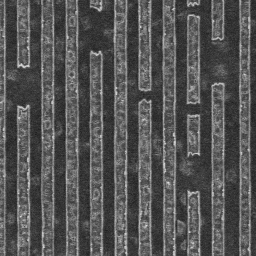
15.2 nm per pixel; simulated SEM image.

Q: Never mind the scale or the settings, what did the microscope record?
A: parallel lines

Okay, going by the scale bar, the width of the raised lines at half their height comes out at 0.185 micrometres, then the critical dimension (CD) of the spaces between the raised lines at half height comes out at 186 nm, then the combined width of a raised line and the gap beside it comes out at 0.374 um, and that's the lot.